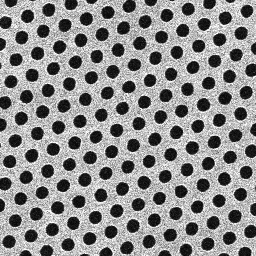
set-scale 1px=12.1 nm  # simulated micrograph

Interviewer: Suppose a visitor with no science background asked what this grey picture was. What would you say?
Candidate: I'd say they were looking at a regular array of holes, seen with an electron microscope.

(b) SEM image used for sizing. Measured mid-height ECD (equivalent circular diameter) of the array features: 0.162 microns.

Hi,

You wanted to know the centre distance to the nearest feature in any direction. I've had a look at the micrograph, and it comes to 21.9 pixels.